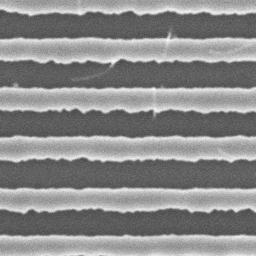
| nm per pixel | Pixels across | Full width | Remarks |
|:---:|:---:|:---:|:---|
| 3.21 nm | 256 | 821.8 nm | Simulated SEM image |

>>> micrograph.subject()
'lines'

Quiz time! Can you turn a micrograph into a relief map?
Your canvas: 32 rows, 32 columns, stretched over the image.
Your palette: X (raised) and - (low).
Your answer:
XXXXXXXXXXXXXXXXXXXXXXXXXXXXXXXX
--XXXXXXXXX--XX--XXX--XXX-XXXXXX
--------------------------------
--------------------------------
--------------------------------
XXXXXXXXXXXXXXXXXXXXXXXXXXXXXXXX
XXXXXXXXXXXXXXXXXXXXXXXXXXXXXXXX
XXX-XXXXXXXXXXX-XXXXXXXX-XXXXXXX
--------------------------------
--------------------------------
--------------------------------
XXXXXXXXXXXXXXXXXXXXXXXXXXXXXXXX
XXXXXXXXXXXXXXXXXXXXXXXXXXXXXXXX
XXXXXXXXXXXXXXXXXXXXXXXXXXXXXXXX
--------------------------------
--------------------------------
--------------------------------
XXXXXXXXXXXXXXXXXXXXXXXXXXXXXXXX
XXXXXXXXXXXXXXXXXXXXXXXXXXXXXXXX
XXXXXXXXXXXXXXXXXXXXXXXXXXXXXXXX
--------------------------------
--------------------------------
--------------------------------
--------------------------------
XXXXXXXXXXXXXXXXXXXXXXXXXXXXXXXX
XXXXXXXXXXXXXXXXXXXXXXXXXXXXXXXX
--X------------X----------------
--------------------------------
--------------------------------
X-----X--------X----XX-XXX----X-
XXXXXXXXXXXXXXXXXXXXXXXXXXXXXXXX
XXXXXXXXXXXXXXXXXXXXXXXXXXXXXXXX